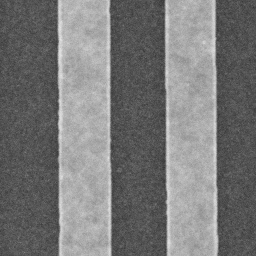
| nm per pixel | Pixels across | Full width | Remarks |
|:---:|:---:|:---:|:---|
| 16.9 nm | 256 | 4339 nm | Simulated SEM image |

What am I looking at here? lines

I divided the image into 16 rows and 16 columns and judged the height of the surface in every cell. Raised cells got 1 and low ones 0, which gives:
0000111000111000
0000111000111000
0000111000111000
0000111000111000
0000111000111000
0000111000111000
0000111000111000
0000111000111000
0000111000111000
0000111000111000
0000111000111000
0000111000111000
0000111000111100
0000111000111100
0000111000111000
0000111000111100